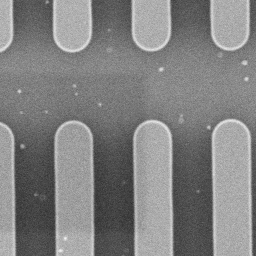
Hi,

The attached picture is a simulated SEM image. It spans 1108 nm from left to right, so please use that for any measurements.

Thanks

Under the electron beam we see groups of lines, slits or small figures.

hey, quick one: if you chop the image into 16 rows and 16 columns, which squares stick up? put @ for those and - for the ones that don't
@--@@@--@@@--@@@
@--@@@--@@@--@@@
@--@@@--@@---@@-
----------------
----------------
----------------
----------------
----------------
@---@@--@@@--@@@
@--@@@--@@@--@@@
@--@@@--@@@--@@@
@--@@@--@@@--@@@
@---@@--@@@--@@@
@---@@--@@@--@@@
@---@@--@@@--@@@
@---@@--@@@--@@@